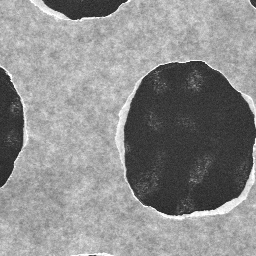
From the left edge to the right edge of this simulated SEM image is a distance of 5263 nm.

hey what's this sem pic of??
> holes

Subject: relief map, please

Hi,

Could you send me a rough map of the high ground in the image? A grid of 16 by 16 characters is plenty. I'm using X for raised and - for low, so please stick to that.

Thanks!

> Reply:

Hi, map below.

XXX----XXXXXXXXX
XXXXXXXXXXXXXXXX
XXXXXXXXXXXXXXXX
XXXXXXXXXXXXXXXX
XXXXXXXXX-----XX
-XXXXXXX-------X
-XXXXXXX--------
--XXXXXX--------
--XXXXX---------
-XXXXXXX--------
-XXXXXXX--------
XXXXXXXX--------
XXXXXXXXX------X
XXXXXXXXXXXXXXXX
XXXXXXXXXXXXXXXX
XXXXXXXXXXXXXXXX